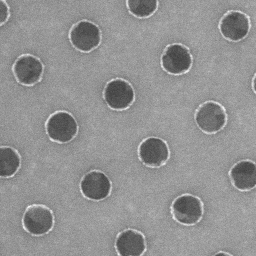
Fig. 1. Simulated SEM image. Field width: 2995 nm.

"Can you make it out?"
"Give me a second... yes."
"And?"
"a regular array of raised bodies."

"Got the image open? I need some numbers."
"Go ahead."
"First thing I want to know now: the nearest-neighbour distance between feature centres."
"779 nm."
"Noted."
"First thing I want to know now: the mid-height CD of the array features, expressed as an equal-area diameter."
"362 nm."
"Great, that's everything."